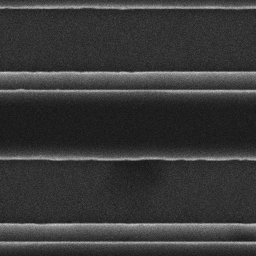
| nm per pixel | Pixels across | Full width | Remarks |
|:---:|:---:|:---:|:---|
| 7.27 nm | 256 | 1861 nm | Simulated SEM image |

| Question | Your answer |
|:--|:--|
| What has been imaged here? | lines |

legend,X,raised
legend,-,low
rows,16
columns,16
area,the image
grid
XXX---XXXXXXXXXX
----------------
----------------
----------------
----------------
XXXXXXXXXXXXXXXX
XXXXXXXXXXXXXXXX
XXXXXXXXXXXXXXXX
XXXXXXXXXXXXXXXX
XXXXXXXXXXXXXXXX
----------------
----------------
----------------
----------------
XXXXXXXXXXXXXXXX
XXXXXXXXXXXXXXXX